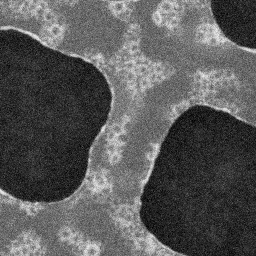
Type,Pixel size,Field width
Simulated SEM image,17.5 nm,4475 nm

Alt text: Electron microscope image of holes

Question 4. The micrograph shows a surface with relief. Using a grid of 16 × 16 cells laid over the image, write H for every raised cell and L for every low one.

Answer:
HHHHHHHHHHHHHLLL
HHHHHHHHHHHHHHLL
LLHHHHHHHHHHHHLL
LLLLLHHHHHHHHHHH
LLLLLLHHHHHHHHHH
LLLLLLLHHHHHHHHH
LLLLLLLHHHHHHHHH
LLLLLLLHHHHLLLLH
LLLLLLHHHHLLLLLL
LLLLLLHHHHLLLLLL
LLLLLLHHHLLLLLLL
LLLLLHHHHLLLLLLL
HLLLHHHHHLLLLLLL
HHHHHHHHHLLLLLLL
HHHHHHHHHLLLLLLL
HHHHHHHHHHLLLLLL